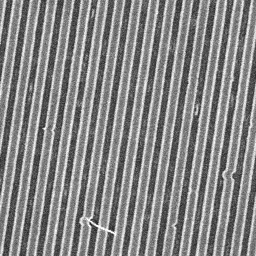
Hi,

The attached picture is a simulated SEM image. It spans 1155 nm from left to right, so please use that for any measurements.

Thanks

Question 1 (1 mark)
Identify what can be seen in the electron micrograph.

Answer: parallel lines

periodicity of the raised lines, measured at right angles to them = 75.8 nm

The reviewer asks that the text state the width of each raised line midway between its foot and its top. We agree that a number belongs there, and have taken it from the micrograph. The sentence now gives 38.5 nm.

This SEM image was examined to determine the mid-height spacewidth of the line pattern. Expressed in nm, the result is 37.9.